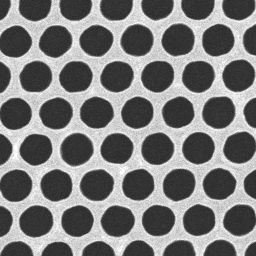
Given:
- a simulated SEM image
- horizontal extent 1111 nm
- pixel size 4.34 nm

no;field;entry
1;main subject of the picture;a regular array of holes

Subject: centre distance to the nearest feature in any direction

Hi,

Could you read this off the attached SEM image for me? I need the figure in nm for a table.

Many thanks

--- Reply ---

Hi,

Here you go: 176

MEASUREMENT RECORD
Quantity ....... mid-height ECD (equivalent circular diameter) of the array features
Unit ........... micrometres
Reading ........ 0.141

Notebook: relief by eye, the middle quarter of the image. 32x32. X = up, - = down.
------XXXX-------XXX-------XXXX-
-------XXX-------XXX-------XXX--
-------XX---------X---------XX--
-------XX--------XX---------X---
-------XX--------XX--------XXX--
------XXXX-------XXX------XXXX--
-----XXXXXX----XXXXXX----XXXXXX-
XXXXXXXXXXXXXXXXXXXXXXXXXXXXXXXX
XXXXXX----XXXXXXX---XXXXXXXX--XX
-XXXX------XXXX------XXXXX-----X
--XX--------XXX-------XXX-------
--XX--------XX--------XX--------
--XX---------X--------XX--------
--XX--------XX--------XXX-------
-XXXX------XXXX-------XXX-------
XXXXXX----XXXXXX-----XXXXX-----X
XXXXXXXXXXXXXXXXXXXXXXXXXXXXXXXX
XX---XXXXXXX---XXXXXXX---XXXXXXX
------XXXX------XXXX------XXXXX-
-------XXX-------XXX-------XXX--
-------XX--------XX--------XX---
-------XX--------XX---------X---
-------XX--------XX--------XXX--
------XXXX------XXXX-------XXX--
-----XXXXXX----XXXXXX-----XXXXX-
XX-XXXXXXXXXXXXXXXXXXXXXXXXXXXXX
XXXXXXX---XXXXXXXX---XXXXXXX---X
-XXXX-------XXXX------XXXX------
--XXX-------XXX-------XXX-------
--XX---------XX--------XX-------
--XX--------XXX--------XX-------
--XX--------XXX--------XX-------